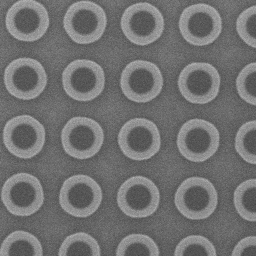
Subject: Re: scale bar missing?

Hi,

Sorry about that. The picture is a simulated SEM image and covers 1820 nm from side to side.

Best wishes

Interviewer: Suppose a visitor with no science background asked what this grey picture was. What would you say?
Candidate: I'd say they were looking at an array of small figures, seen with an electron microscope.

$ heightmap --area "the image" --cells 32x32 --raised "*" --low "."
..***....***.....**.............
.*****..*****...****...****...**
.*****..*****..*****..******..**
.*****..*****..*****..******..**
..***....****...****...****...**
.................*......**.....*
................................
..**............................
.****...*****...****...****....*
.*****..*****..*****..*****...**
.*****..*****..*****..*****...**
.****...*****..*****...****...**
..........*.....***.....**.....*
................................
...*............................
.****...****....***....***.....*
.*****..*****..*****..*****...**
******..*****..*****..*****..***
.****...****...*****..*****..***
..**.....**.....***....***....**
................................
................................
.****...****....***....***.....*
*****...****...*****..*****...**
*****..******..*****..*****..***
.****...****...*****..*****..***
.***....****...****....****...**
...............................*
................................
.***.....**.....**..............
*****...****...****...****....**
*****..*****...*****..*****..***